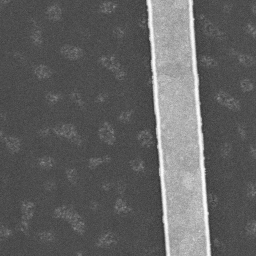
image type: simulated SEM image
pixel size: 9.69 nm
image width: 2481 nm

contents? one or a few lines or trenches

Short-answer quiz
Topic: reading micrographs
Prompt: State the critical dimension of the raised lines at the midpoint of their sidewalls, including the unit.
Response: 396 nanometres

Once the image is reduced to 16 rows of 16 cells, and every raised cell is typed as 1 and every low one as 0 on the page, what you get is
0000000001110000
0000000001110000
0000000000110000
0000000000110000
0000000000110000
0000000000110000
0000000000110000
0000000000110000
0000000000111000
0000000000111000
0000000000111000
0000000000111000
0000000000111000
0000000000111000
0000000000111000
0000000000111000